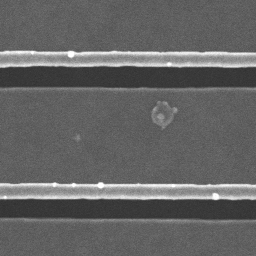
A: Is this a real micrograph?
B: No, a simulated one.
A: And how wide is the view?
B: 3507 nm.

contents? lines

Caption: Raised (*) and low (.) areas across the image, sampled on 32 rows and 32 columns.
********************************
********************************
********************************
********************************
********************************
********************************
********************************
********************************
................................
................................
................................
********************************
********************************
********************************
********************************
********************************
********************************
********************************
********************************
********************************
********************************
********************************
********************************
********************************
********************************
................................
................................
************************........
********************************
********************************
********************************
********************************